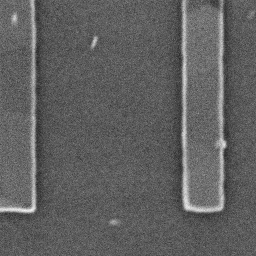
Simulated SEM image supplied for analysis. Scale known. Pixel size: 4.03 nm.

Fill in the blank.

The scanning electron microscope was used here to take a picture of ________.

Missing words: wiring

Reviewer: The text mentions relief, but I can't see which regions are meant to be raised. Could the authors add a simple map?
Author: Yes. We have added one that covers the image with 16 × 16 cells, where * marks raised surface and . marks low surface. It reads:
**.........***..
**.........***..
**.........***..
**.........***..
**.........***..
**.........***..
**.........***..
**.........***..
**.........***..
**.........***..
**.........***..
**.........***..
**.........***..
................
................
................